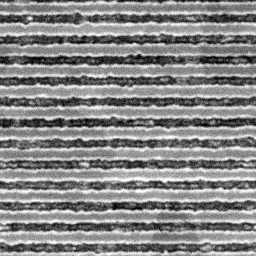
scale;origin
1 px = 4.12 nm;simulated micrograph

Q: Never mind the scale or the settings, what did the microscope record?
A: parallel lines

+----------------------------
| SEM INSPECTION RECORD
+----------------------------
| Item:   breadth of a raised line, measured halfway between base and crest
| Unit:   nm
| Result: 45.9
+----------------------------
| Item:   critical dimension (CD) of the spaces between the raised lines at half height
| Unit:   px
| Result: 9.39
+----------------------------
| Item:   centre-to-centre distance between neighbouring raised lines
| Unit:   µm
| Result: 0.086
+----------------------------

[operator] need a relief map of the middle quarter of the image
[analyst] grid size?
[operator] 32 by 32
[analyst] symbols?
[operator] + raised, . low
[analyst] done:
++.+++++.+++++++++++++++.+++++++
++++++++++++++++++++++++++++++++
++++++++++++++++++++++++++++++++
................................
................................
......................+..++...+.
++++++++++++++++++++++++++++++++
++++++++++++++++++++++++++++++++
+...++..................+.......
................................
..........+................+....
++++++++++++++++++++++++++++++++
++++++++++++++++++++++++++++++++
+.+++..........+.+.....+.......+
................................
................................
++++++++++++++++++++++++++++++++
++++++++++++++++++++++++++++++++
+++++++++++++.+.++++++++++..+++.
................................
................................
+++++++++++++++++++.++++++++++++
++++++++++++++++++++++++++++++++
++++++++.+++++++++++++++++++++++
................................
................................
++++++++++.+++++++++++++++++.+++
++++++++++++++++++++++++++++++++
++++++++++++++++++++++++++++++++
................................
................................
...+...+.............+++........